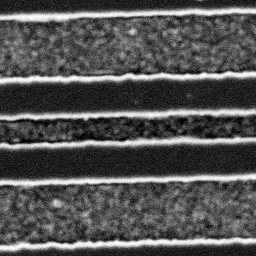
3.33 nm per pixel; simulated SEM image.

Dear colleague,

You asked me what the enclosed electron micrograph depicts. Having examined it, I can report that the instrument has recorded lines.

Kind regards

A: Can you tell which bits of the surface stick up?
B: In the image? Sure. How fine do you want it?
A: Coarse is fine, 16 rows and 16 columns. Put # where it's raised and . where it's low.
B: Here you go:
################
................
................
................
................
################
################
#...............
................
################
################
................
................
................
................
################